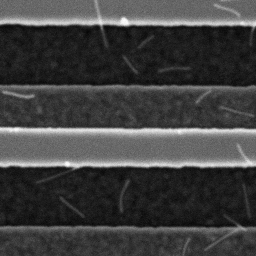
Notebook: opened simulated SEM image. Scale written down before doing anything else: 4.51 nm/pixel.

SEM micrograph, lines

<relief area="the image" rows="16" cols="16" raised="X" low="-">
XXXXXXXXXXXXXXXX
-XXXXXXXXXXXXXXX
----------------
----------------
----------------
XXXXXXXXXXXXXXXX
XXXXXXXXXXXXXXXX
XXXXXXXXXXXXXXXX
XXXXXXXXXXXXXXXX
XXXXXXXXXXXXXXXX
----------------
----------------
----------------
----------------
XXXXXXXXXXXXXXXX
XXXXXXXXXXXXXXXX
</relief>